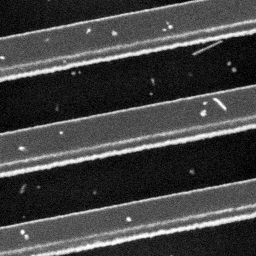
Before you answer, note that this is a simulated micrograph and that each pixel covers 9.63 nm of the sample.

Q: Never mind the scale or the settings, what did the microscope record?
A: lines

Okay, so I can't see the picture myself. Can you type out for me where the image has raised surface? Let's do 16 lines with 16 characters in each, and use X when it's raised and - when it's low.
----------XXXXXX
-----XXXXXXXXXXX
XXXXXXXXXXXXX---
XXXXXXXX--------
XXX-------------
---------------X
----------XXXXXX
-----XXXXXXXXXXX
XXXXXXXXXXXXX---
XXXXXXXX--------
XXX-------------
--------------XX
---------XXXXXXX
----XXXXXXXXXXXX
XXXXXXXXXX------
XXXXX-----------